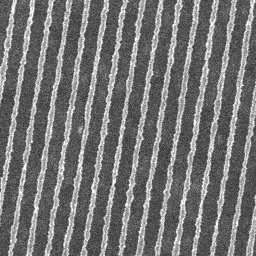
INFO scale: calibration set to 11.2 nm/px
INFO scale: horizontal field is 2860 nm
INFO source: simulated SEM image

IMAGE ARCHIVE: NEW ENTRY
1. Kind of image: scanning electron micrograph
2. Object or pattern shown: parallel lines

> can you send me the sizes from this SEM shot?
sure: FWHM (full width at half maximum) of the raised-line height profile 46.9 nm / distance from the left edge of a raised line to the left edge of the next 18.1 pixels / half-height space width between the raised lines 14.2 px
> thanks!